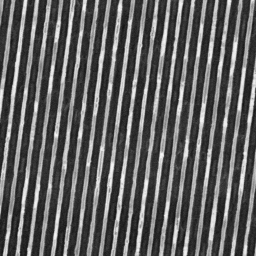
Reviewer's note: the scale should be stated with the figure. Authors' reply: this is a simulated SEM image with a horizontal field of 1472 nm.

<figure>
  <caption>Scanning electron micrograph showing parallel lines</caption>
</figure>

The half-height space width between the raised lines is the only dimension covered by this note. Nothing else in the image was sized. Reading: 49.1 nm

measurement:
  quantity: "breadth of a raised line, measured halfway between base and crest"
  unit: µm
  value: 0.0214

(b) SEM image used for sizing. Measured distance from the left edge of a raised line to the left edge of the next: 68.3 nm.